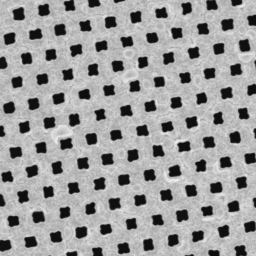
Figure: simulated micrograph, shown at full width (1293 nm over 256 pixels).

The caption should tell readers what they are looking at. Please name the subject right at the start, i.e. a regular array of holes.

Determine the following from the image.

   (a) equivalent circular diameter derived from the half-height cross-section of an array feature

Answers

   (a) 59 nanometres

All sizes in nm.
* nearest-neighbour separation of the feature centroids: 127